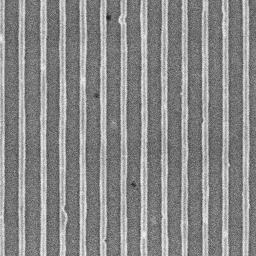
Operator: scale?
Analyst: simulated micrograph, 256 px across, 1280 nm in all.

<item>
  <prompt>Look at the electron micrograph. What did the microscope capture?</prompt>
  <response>parallel lines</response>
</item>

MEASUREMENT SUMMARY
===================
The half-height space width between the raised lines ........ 74.4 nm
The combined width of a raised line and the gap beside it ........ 102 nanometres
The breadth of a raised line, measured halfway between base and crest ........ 0.0263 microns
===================